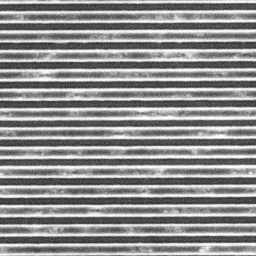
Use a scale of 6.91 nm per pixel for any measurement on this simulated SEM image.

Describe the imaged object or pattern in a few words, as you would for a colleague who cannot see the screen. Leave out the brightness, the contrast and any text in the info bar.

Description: parallel lines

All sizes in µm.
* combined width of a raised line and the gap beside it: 0.134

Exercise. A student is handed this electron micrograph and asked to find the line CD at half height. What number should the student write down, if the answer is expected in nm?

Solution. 75.1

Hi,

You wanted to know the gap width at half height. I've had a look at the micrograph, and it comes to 62.2 nanometers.